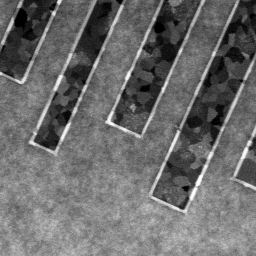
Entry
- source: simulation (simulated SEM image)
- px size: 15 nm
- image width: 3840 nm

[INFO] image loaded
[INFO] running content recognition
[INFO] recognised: one or a few lines or trenches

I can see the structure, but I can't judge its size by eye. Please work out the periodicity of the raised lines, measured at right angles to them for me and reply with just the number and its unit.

66.4 px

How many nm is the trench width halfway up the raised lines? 488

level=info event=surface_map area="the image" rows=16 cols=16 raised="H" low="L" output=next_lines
LHHHLLHHLLHHLLLH
LHHLLHHLLLHHLLHH
HHHLLHHLLHHHLLHH
HHLLHHLLLHHLLHHH
HHLLHHLLHHHLLHHL
LLLHHLLLHHLLHHHL
LLLHHLLHHHLLHHHL
LLLHLLLHHLLLHHLL
LLHHLLLLLLLHHHLL
LLLLLLLLLLLHHLLH
LLLLLLLLLLHHHLLH
LLLLLLLLLLHHLLLH
LLLLLLLLLLHHLLLL
LLLLLLLLLLLLLLLL
LLLLLLLLLLLLLLLL
LLLLLLLLLLLLLLLL